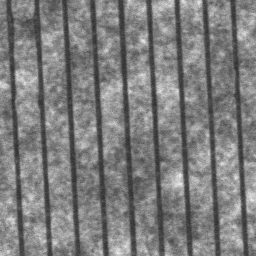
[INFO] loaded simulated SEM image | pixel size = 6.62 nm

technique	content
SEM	parallel lines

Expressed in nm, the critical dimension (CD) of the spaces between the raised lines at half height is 37.2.